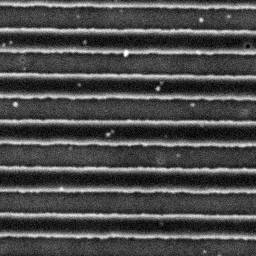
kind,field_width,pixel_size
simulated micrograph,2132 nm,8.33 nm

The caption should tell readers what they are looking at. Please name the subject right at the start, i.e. lines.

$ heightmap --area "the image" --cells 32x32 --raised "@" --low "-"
@@@@@@@@@@@@@@@@@@@@@@@@@@@@@@@@
--------------------------------
--------------------------------
--------------------------------
@@@@@@@@@@@@@@@@@@@@@@@@@@@@@@@@
@@@@@@@@@@@@@@@@@@@@@@@@@@@@@@@@
-@@@@@@@-@@@@@@@@@@@@@@@@@@@@@@@
--------------------------------
--------------------------------
@@@@@@@@@@@@@@@@@@@@@@@@@-@-----
@@@@@@@@@@@@@@@@@@@@@@@@@@@@@@@@
@@@@@@@@@@@@@@@@@@@@@@@@@@@@@@@@
--------------------------------
--------------------------------
--------------------------------
@@@@@@@@@@@@@@@@@@@@@@@@@@@@@@@@
@@@@@@@@@@@@@@@@@@@@@@@@@@@@@@@@
@@@@@@@@@@@@@@@@@@@@@@@@@@@@@@@@
--------------------------------
--------------------------------
--------------------------------
@@@@@@@@@@@@@@@@@@@@@@@@@@@@@@@@
@@@@@@@@@@@@@@@@@@@@@@@@@@@@@@@@
@@@@@@@@@@@@@@@@@@@@@@@@@@@@@@@@
--------------------------------
--------------------------------
--------------------------------
@@@@@@@@@@@@@@@@@@@@@@@@@@@@@@@@
@@@@@@@@@@@@@@@@@@@@@@@@@@@@@@@@
---@@@@@@@@@@@@@@@@@@@@@@@@@@@@@
--------------------------------
--------------------------------